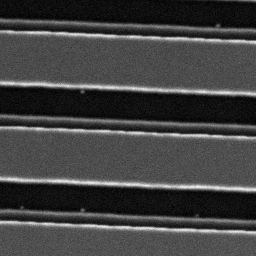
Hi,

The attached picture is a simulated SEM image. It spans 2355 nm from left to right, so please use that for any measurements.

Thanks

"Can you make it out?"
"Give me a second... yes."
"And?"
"lines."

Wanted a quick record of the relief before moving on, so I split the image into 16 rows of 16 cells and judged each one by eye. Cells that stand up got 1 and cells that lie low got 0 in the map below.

0000000000000000
0000000000000000
1111111111111100
1111111111111111
1111111111111111
0000000011111111
0000000000000000
0000000000000000
1111111111111100
1111111111111111
1111111111111111
0000001111111111
0000000000000000
0000000000000000
1111111111111111
1111111111111111